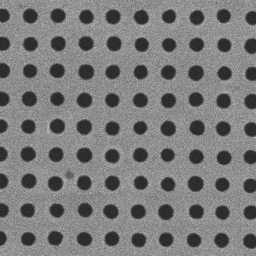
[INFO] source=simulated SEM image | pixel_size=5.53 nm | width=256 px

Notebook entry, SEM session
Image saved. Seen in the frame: a regular array of holes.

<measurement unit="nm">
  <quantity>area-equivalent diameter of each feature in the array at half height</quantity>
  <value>77.8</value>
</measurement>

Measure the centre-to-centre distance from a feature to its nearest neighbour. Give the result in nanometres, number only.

149